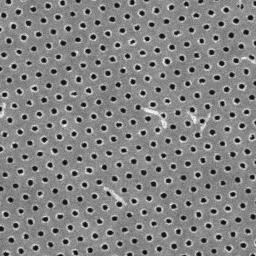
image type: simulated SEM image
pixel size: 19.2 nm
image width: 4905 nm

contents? a regular array of holes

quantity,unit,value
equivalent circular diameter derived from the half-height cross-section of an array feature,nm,104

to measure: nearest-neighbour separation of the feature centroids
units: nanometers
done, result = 282